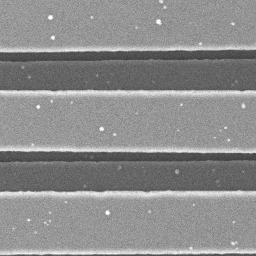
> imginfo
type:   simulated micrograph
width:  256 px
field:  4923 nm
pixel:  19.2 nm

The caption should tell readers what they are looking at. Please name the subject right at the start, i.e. lines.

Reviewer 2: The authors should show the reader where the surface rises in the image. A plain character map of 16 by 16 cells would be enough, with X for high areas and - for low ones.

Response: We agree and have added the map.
XXXXXXXXXXXXXXXX
XXXXXXXXXXXXXXXX
XXXXXXXXXXXXXXXX
----------------
----------------
----------------
XXXXXXXXXXXXXXXX
XXXXXXXXXXXXXXXX
XXXXXXXXXXXXXXXX
-----------XXXXX
----------------
----------------
XXXXXXXXXXXXXXXX
XXXXXXXXXXXXXXXX
XXXXXXXXXXXXXXXX
XXXXXXXXXXXXXXXX